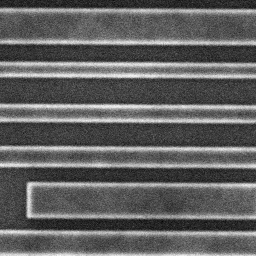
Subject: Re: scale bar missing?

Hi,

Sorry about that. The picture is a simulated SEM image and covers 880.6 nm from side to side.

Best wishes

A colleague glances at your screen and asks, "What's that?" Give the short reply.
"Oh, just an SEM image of groups of lines, slits or small figures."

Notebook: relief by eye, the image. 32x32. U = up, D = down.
DDDDDDDDDDDDDDDDDDDDDDDDDDDDDDDD
UUUUUUUUUUUUUUUUUUUUUUUUUUUUUUUU
UUUUUUUUUUUUUUUUUUUUUUUUUUUUUUUU
UUUUUUUUUUUUUUUUUUUUUUUUUUUUUUUU
UUUUUUUUUUUUUUUUUUUUUUUUUUUUUUUU
DDDDDDDDDDDDDDDDDDDDDDDDDDDDDDDD
DDDDDDDDDDDDDDDDDDDDDDDDDDDDDDDD
DDDDDDDDDDDDDDDDDDDDDDDDDDDDDDDD
UUUUUUUUUUUUUUUUUUUUUUUUUUUUUUUU
DDUUUUUUUUUUUUUUUUUUUUUUUUUUUUUU
DDDDDDDDDDDDDDDDDDDDDDDDDDDDDDDD
DDDDDDDDDDDDDDDDDDDDDDDDDDDDDDDD
DDDDDDDDDDDDDDDDDDDDDDDDDDDDDDDD
UUUUUUUUUUUUUUUUUUUUUUUUUUUUUUUU
UUUUUUUUUUUUUUUUUUUUUUUUUUUUUUUU
DDDDDDDDDDDDDDDDDDDDDDDDDDDDDDDD
DDDDDDDDDDDDDDDDDDDDDDDDDDDDDDDD
DDDDDDDDDDDDDDDDDDDDDDDDDDDDDDDD
DDDDDDDDDDDDDDDDDDDDDDDDDDDDDDDD
UUUUUUUUUUUUUUUUUUUUUUUUUUUUUUUU
UUUUUUUUUUUUUUUUUUUUUUUUUUUUUUUU
DDDDDDDDDDDDDDDDDDDDDDDDDDDDDDDD
DDDDDDDDDDDDDDDDDDDDDDDDDDDDDDDD
DDDDUUUUUUUUUUUUUUUUUUUUUUUUUUUU
DDDDUUUUUUUUUUUUUUUUUUUUUUUUUUUU
DDDDUUUUUUUUUUUUUUUUUUUUUUUUUUUU
DDDDUUUUUUUUUUUUUUUUUUUUUUUUUUUU
DDDDDDDDDDDDDDDDDDDDDDDDDDDDDDDD
DDDDDDDDDDDDDDDDDDDDDDDDDDDDDDDD
UUUUUUUUUUUUUUUUUUUUUUUUUUUUUUUU
UUUUUUUUUUUUUUUUUUUUUUUUUUUUUUUU
UUUUUUUUUUUUUUUUUUUUUUUUUUUUUUUU